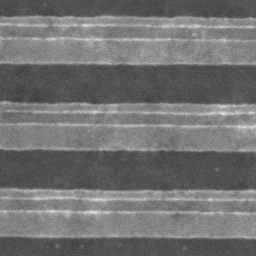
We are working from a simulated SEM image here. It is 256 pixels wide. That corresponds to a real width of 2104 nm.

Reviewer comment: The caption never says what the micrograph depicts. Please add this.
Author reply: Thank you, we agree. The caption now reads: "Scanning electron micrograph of lines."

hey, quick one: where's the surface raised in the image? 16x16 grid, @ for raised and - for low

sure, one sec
----------------
@@@@@@@@@@@@@@@@
@@@@@@@@@@@@@@@@
@@@@@@@@@@@@@@@@
----------------
----------------
@@@-@---@@------
@@@@@@@@@@@@@@@@
@@@@@@@@@@@@@@@@
----------------
----------------
----------------
@@@@@@@@@@@@@@@@
@@@@@@@@@@@@@@@@
@@@@@@@@@@@@@@@@
----------------